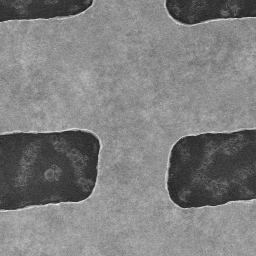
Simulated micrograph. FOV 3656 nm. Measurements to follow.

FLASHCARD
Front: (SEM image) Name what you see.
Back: holes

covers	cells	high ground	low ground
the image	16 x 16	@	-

-----@@@@@------
@@@@@@@@@@@-@@@@
@@@@@@@@@@@@@@@@
@@@@@@@@@@@@@@@@
@@@@@@@@@@@@@@@@
@@@@@@@@@@@@@@@@
@@@@@@@@@@@@@@@@
@@@@@@@@@@@@@@@@
------@@@@@@----
------@@@@@-----
------@@@@@-----
------@@@@------
-----@@@@@@-----
@@@@@@@@@@@@@@@@
@@@@@@@@@@@@@@@@
@@@@@@@@@@@@@@@@